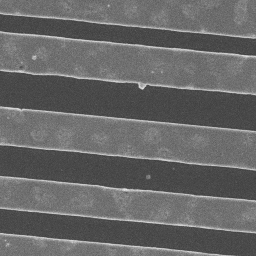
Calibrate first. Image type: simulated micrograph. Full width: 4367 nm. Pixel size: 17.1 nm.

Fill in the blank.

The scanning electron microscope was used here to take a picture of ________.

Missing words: one or a few lines or trenches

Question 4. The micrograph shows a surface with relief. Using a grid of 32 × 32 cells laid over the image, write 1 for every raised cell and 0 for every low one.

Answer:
11111111111111111111111111111111
11111111111111111111111111111111
00000000011111111111111111111111
00000000000000000001111111111111
11111100000000000000000000000111
11111111111111110000000000000000
11111111111111111111111111000000
11111111111111111111111111111111
11011111111111111111111111111111
00000000111111111111111111111111
00000000000000000111111111111111
00000000000000000000000000001111
00000000000000000000000000000000
10000000000000000000000000000000
11111111111100000000000000000000
11111111111111111111110000000000
11111111111111111111111111111111
11111111111111111111111111111111
00001111111111111111111111111111
00000000000000011111011111111111
00000000000000000000000011111111
00000000000000000000000000000000
11110000000000000000000000000000
11111111111111000000000000000000
11111111111111101111111110000000
11111111101111111111111111111111
00000111111111111111111111111111
00000000000000111111111111111111
00000000000000000000000001111111
11100000000000000000000000000000
11111111111111000000000000000000
11111111111111111111111110000000